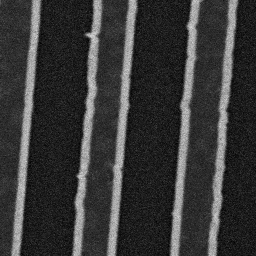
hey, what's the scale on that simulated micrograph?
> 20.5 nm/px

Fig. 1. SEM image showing one or a few lines or trenches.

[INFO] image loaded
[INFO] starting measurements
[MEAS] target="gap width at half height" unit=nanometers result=1280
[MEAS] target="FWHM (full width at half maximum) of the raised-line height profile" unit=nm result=740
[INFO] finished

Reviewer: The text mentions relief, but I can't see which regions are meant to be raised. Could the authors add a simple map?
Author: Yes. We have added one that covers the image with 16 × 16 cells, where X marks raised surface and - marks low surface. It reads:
XX----XX----XXX-
XX----XX----XX--
XX----XX----XX--
XX----XX----XX--
XX----XX----XX--
XX----XX----XX--
XX----XX----XX--
XX----XX----XX--
XX---XXX----XX--
XX---XX----XXX--
X----XX----XXX--
X----XX----XXX--
X----XX----XXX--
X----XX----XX---
X----XX----XX---
X----XX----XX---